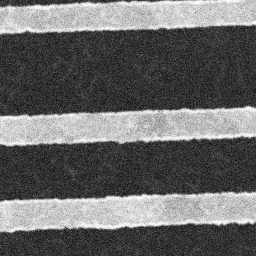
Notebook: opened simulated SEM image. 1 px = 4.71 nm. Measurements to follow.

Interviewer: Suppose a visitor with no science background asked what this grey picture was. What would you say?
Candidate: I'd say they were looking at one or a few lines or trenches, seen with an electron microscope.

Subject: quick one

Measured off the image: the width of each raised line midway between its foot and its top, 0.133 µm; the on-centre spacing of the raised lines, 449 nm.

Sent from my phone